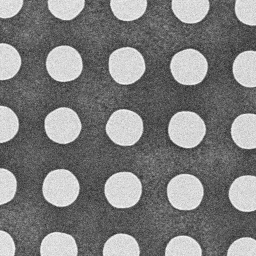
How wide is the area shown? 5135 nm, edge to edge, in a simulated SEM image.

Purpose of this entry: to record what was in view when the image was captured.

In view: an array of small figures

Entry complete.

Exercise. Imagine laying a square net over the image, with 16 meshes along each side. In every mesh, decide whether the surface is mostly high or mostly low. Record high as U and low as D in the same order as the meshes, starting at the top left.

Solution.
UDDUUDDUUDDUUDDU
DDDDDDDDDDDDDDDD
DDDDDDDDDDDDDDDD
UDDUUDDUUDDUUDDU
UDDUUDDUUDDUUDDU
DDDDDDDDDDDDDDDD
DDDDDDDDDDDDDDDD
UDDUUDDUUDDUUDDU
UDDUUDDUUDDUUDDU
DDDDDDDDDDDDDDDD
DDDDDDDDDDDDDDDD
UDDUUDDUUDDUUDDU
UDDUUDDUUDDUUDUU
DDDDDDDDDDDDDDDD
DDDDDDDDDDDDDDDD
UDDUUDDUUDUUDDUU